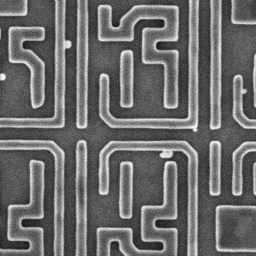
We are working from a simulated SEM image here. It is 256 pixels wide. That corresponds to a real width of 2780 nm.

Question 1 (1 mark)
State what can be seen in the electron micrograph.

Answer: wiring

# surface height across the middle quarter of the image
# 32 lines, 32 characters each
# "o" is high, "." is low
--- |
...ooo........ooo........ooo...o
...ooo........ooo........ooo...o
...ooo........ooo........ooo...o
...ooo...oo...ooo........ooo...o
...ooo...oo...ooo........ooo...o
...ooo...oo...ooo........ooo...o
...ooo...oo...ooo........ooo...o
...ooo...oo...ooo........ooo...o
...ooo...oo...ooo........ooo...o
...ooo...oo...ooo........ooo...o
...ooo...oo...ooo........ooo...o
...ooo...oo....................o
...ooo...ooo...................o
...ooo...oooo..................o
...ooo....oooooooooooooooooooooo
...ooo.....ooooooooooooooooooooo
................................
................................
................................
....o...................oooooo..
...ooo....oooooooooooooooooooooo
...ooo....oooo...ooooooooooooooo
...ooo...ooo.............oo...oo
...ooo...oo....................o
...ooo...oo....................o
...ooo...oo...ooo........ooo...o
...ooo...oo...ooo........ooo...o
...ooo...oo...ooo........ooo...o
...ooo...oo...ooo........ooo...o
...ooo...oo...ooo........ooo...o
...ooo...oo...ooo........ooo...o
...ooo...oo...ooo........ooo...o